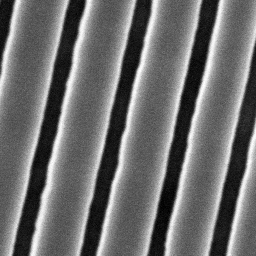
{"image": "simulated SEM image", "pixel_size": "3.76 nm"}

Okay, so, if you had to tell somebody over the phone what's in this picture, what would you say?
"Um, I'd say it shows lines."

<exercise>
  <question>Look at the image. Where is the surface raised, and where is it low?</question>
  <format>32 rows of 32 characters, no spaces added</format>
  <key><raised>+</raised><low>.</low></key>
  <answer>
..++++++...++++++..++++++..+++++
..++++++...++++++..++++++..+++++
.+++++++..++++++...++++++..+++++
.+++++++..++++++...++++++..+++++
.++++++...++++++..++++++...+++++
.++++++...++++++..++++++..++++++
.++++++..++++++...++++++..++++++
+++++++..++++++...++++++..+++++.
+++++++..++++++..++++++...+++++.
++++++...++++++..++++++..++++++.
++++++..+++++++..++++++..++++++.
++++++..++++++...++++++..++++++.
++++++..++++++..++++++...+++++..
++++++..++++++..++++++...+++++..
+++++...++++++..++++++..++++++..
+++++..+++++++..++++++..++++++..
+++++..++++++...++++++..+++++...
+++++..++++++..++++++...+++++..+
++++...++++++..++++++..++++++..+
++++..+++++++..++++++..++++++..+
++++..++++++...++++++..+++++...+
++++..++++++...++++++..+++++...+
++++..++++++..++++++..++++++..++
+++...++++++..++++++..++++++..++
+++..+++++++..++++++..++++++..++
+++..++++++...++++++..+++++...++
+++..++++++..+++++++..+++++...++
++...++++++..++++++..++++++..+++
++...++++++..++++++..++++++..+++
++..++++++...++++++..++++++..+++
++..++++++..+++++++..+++++...+++
++..++++++..++++++...+++++..++++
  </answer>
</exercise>